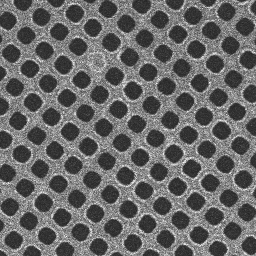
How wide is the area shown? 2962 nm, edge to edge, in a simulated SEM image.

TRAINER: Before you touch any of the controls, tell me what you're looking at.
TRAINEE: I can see a regular array of holes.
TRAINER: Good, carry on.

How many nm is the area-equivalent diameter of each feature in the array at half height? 204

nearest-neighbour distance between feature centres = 271 nanometres